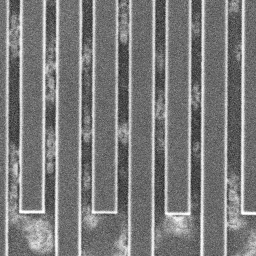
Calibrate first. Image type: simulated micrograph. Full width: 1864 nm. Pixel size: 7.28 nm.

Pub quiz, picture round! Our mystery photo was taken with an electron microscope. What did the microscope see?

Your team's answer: parallel lines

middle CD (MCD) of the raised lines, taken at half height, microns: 0.182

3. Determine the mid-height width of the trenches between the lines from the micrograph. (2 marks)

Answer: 87.3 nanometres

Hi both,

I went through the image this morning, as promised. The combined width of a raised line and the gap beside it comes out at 36.4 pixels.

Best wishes